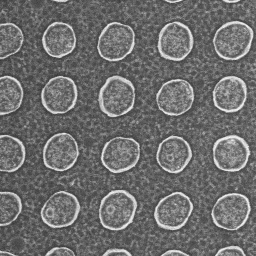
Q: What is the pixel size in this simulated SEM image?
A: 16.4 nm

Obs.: a regular array of raised bodies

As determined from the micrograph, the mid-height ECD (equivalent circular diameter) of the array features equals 35.3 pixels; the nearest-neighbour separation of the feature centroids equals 914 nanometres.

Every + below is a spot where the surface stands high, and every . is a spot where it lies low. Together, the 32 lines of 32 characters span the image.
................................
................................
................................
++....+++....+++.....++.....+++.
+++..++++....++++...++++...++++.
+++...+++...+++++...++++...++++.
++....+++...++++....++++...++++.
................................
................................
................................
++....+++....+++.....+++...+++..
+++..++++....++++...++++...++++.
+++..++++....++++...++++...++++.
++....+++....+++....++++...+++..
................................
................................
................................
++....+++.....+++....++.....++..
+++...++++...++++...++++...++++.
+++...++++...++++...++++...++++.
+++...+++....++++...+++....++++.
................................
................................
................................
++.....++....+++.....++.....++..
+++...++++...++++...++++...++++.
++...+++++...++++..+++++...++++.
++....+++....+++....+++....++++.
..............+.............++..
................................
................................
......+++.....++.....+.....+++..